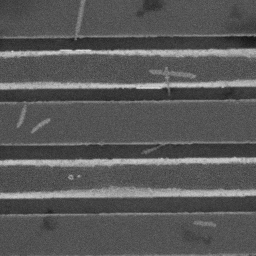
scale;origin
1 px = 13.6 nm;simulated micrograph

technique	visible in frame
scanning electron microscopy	lines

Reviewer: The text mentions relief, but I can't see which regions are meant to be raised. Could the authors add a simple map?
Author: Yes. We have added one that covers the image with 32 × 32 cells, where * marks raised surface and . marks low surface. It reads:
********************************
********************************
********************************
********************************
******************.*............
................................
..........................*.....
********************************
********************************
********************************
********************************
................................
..............................**
********************************
********************************
********************************
********************************
********************************
................................
................................
********************************
********************************
********************************
********************************
******..........................
................................
................................
********************************
********************************
********************************
********************************
********************************